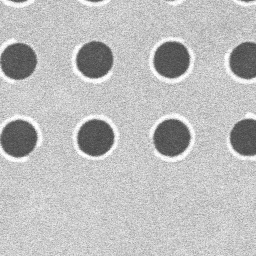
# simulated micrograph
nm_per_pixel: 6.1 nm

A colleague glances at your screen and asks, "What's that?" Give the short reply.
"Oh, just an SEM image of holes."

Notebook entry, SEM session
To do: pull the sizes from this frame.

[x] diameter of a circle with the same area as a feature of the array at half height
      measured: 37 pixels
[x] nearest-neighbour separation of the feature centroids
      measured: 466 nm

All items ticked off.